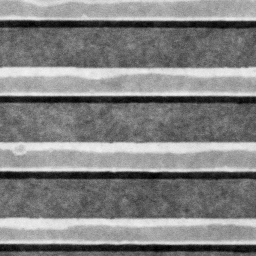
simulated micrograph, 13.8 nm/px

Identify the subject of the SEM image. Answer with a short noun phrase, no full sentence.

lines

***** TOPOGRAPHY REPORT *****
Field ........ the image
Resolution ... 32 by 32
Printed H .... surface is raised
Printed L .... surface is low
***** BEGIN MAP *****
HHHHHHHHHHHHHHHHHHHHHHHHHHHHHHHH
HHHHHHHHHHHHHHHHHHHHHHHHHHHHHHHH
LLLLLLLLLHLLLLHHHHHHHHHHHHHHHHHH
LLLLLLLLLLLLLLLLLLLLLLLLLLLLLLLL
LLLLLLLLLLLLLLLLLLLLLLLLLLLLLLLL
LLLLLLLLLLLLLLLLLLLLLLLLLLLLLLLL
LLLLLLLLLLLLLLLLLLLLLLLLLLLLLLLL
LLLLLLLLLLLLLLLLLLLLLLLLLLLLLLLL
LLLLLLLLLLLLLLLLLLLLLLLLLLLLLLLL
HHHHHHHHHHHHHHHHHHHHHHHHHHHHHHHH
HHHHHHHHHHHHHHHHHHHHHHHHHHHHHHHH
HHHHHHHHHHHHHHHHHHHHHHHHHHHHHHHH
LLLLLLLLLLLLLLLLLLLLLLLLLLLLLLLL
LLLLLLLLLLLLLLLLLLLLLLLLLLLLLLLL
LLLLLLLLLLLLLLLLLLLLLLLLLLLLLLLL
LLLLLLLLLLLLLLLLLLLLLLLLLLLLLLLL
LLLLLLLLLLLLLLLLLLLLLLLLLLLLLLLL
LLLLLLLLLLLLLLLLLLLLLLLLLLLLLLLL
HHHHHHHHHHHHHHHHHHHHHHHHHHHHHHHH
HHHHHHHHHHHHHHHHHHHHHHHHHHHHHHHH
HHHHHHHHHHHHHHHHHHHHHHHHHHHHHHHH
LLLLLLLLLLLLLLLLLLLLLLLLLLLLLLLL
LLLLLLLLLLLLLLLLLLLLLLLLLLLLLLLL
LLLLLLLLLLLLLLLLLLLLLLLLLLLLLLLL
LLLLLLLLLLLLLLLLLLLLLLLLLLLLLLLL
LLLLLLLLLLLLLLLLLLLLLLLLLLLLLLLL
LLLLLLLLLLLLLLLLLLLLLLLLLLLLLLLL
LLLLLLLLLLLLLLLLLLLLLLLLLLLLLLLL
HHHHHHHHHHHHHHHHHHHHHHHHHHHHHHHH
HHHHHHHHHHHHHHHHHHHHHHHHHHHHHHHH
LLLLLLLLLLLLLLLLLLLLLLLLLLLLLLLL
LLLLLLLLLLLLLLLLLLLLLLLLLLLLLLLL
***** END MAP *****